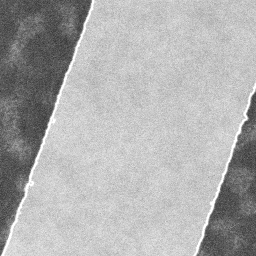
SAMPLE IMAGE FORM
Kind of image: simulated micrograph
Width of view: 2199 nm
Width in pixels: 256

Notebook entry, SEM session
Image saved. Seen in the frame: one or a few lines or trenches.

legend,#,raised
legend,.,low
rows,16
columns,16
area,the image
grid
######..........
#####...........
#####...........
#####...........
####............
####............
####............
###............#
###............#
###...........##
##............##
##............##
#............###
#............###
#............###
............####